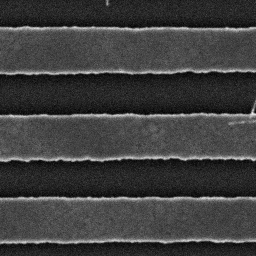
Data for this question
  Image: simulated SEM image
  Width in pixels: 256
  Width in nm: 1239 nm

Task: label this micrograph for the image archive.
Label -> lines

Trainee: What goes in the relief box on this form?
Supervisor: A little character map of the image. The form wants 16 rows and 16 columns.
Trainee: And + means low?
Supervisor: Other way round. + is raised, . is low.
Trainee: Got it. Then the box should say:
................
................
++++++++++++++++
++++++++++++++++
+++++++++++.+...
................
................
++++++++++++++++
++++++++++++++++
++++++++++++++++
................
................
++++++++++++++++
++++++++++++++++
++++++++++++++++
................